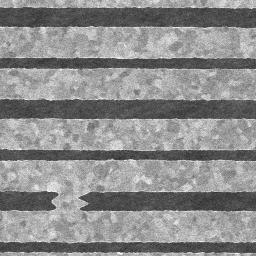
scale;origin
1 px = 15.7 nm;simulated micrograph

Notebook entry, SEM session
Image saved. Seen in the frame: parallel lines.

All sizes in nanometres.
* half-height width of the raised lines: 483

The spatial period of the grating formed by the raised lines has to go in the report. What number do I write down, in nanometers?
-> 723